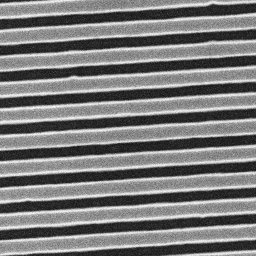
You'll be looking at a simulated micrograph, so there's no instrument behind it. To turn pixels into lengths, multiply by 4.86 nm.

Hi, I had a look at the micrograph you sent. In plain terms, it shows parallel lines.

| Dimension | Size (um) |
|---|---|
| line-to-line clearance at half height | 0.0588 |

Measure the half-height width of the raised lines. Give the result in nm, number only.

71.6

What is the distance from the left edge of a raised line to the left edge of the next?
128 nm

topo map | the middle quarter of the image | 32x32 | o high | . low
o...............................
................................
....................oooooooooooo
..oooooooooooooooooooooooooooooo
oooooooooooooooooooooooooooooooo
oooooooooooooooooooooooooooo....
oooooooooooo....................
................................
............................oooo
.............ooooooooooooooooooo
oooooooooooooooooooooooooooooooo
oooooooooooooooooooooooooooooooo
ooooooooooooooooooooo...........
ooooo...........................
................................
........................oooooooo
........oooooooooooooooooooooooo
oooooooooooooooooooooooooooooooo
oooooooooooooooooooooooooooooo..
oooooooooooooooo................
................................
................................
................oooooooooooooooo
....oooooooooooooooooooooooooooo
oooooooooooooooooooooooooooooooo
oooooooooooooooooooooooo........
oooooooo........................
................................
........................oo.ooooo
........oooooooooooooooooooooooo
oooooooooooooooooooooooooooooooo
ooooooooooooooooooooooooooooooo.